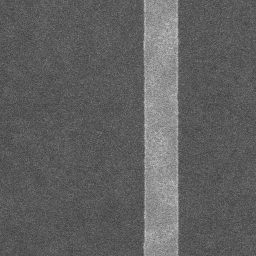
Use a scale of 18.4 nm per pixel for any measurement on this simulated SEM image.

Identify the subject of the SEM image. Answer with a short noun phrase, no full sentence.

one or a few lines or trenches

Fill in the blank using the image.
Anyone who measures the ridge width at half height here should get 595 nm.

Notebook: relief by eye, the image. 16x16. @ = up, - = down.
---------@@-----
---------@@-----
---------@@-----
---------@@-----
---------@@-----
---------@@-----
---------@@-----
---------@@-----
---------@@-----
---------@@-----
---------@@-----
---------@@-----
---------@@-----
---------@@-----
---------@@-----
---------@@-----